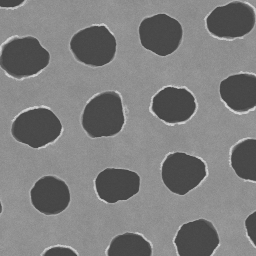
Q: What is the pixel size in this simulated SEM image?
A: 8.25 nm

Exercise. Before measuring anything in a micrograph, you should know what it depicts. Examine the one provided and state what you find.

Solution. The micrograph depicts a regular array of holes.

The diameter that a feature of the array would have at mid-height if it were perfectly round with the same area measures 345 nm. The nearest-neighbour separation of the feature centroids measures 0.557 µm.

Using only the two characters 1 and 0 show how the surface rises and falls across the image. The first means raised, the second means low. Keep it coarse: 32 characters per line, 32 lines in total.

00111111111111111111111111111011
11111111111111111111111111100000
11111111111111111100001111000000
11111111111001111000000111000000
11111111100000111000000111100011
10000111100000011100001111111111
00000011100000111110001111111111
00000011110000111111111111111111
00000111111111111111111111111111
11011111111111111111111111111001
11111111111111111111111111110000
11111111111111111111000011100000
11111111111100011110000011110000
11111111111000011110000011111001
11000001110000011111000011111111
11000000110000011111111111111111
11000000111000011111111111111111
11000001111111111111111111111110
11111111111111111111111111111000
11111111111111111111100011111000
11111111111111111111000001111000
11111111111110000111000000111000
11111001111100000111000001111110
11110000111100000111100011111111
11110000011100000111111111111111
11110000111111111111111111111111
11111000111111111111111111111111
11111111111111111111111111111110
11111111111111111111111000011110
11111111111111100011110000011110
11111111111111000001110000011111
11111100011111000001110000011111